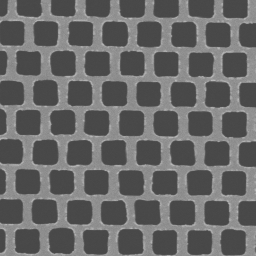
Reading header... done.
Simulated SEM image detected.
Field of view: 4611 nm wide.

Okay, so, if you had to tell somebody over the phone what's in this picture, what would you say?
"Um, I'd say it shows a regular array of holes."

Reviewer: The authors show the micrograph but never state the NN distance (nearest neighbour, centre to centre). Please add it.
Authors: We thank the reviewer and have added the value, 609 nm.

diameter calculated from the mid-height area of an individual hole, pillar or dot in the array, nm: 498